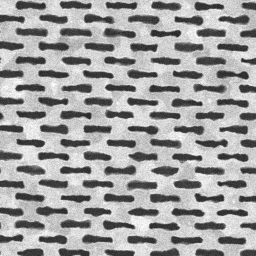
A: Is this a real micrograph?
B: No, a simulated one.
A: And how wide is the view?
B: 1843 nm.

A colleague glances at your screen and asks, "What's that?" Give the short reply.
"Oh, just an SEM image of a regular array of holes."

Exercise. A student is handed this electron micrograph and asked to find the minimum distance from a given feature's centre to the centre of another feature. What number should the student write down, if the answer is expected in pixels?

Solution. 25